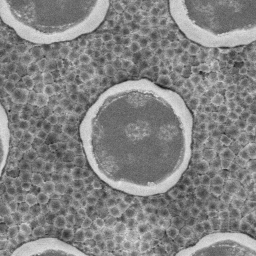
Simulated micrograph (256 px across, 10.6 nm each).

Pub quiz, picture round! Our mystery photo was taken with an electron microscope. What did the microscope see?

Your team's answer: raised bodies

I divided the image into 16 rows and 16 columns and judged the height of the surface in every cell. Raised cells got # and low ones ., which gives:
######.....#####
.#####......####
.............#..
................
................
.......###......
......#####.....
.....#######....
.....#######....
.....#######....
......#####.....
.......####.....
................
................
................
..##........####